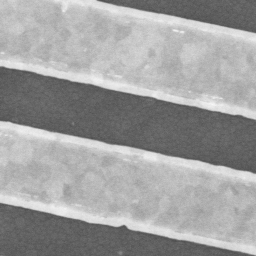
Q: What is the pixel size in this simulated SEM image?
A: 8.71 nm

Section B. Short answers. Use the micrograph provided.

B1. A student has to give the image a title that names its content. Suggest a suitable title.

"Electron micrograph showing one or a few lines or trenches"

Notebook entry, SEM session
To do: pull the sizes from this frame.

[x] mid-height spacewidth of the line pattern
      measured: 530 nm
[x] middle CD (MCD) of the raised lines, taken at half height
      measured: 640 nm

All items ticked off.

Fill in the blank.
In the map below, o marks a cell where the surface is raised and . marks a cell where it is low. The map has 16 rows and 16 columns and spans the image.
ooooooo.........
oooooooooooo....
oooooooooooooooo
oooooooooooooooo
...ooooooooooooo
........oooooooo
.............ooo
................
ooo.............
oooooooo........
ooooooooooooo...
oooooooooooooooo
oooooooooooooooo
.....ooooooooooo
..........oooooo
...............o